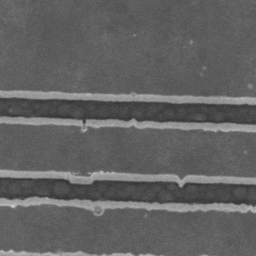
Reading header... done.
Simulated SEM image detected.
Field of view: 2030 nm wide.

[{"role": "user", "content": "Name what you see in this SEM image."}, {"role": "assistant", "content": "one or a few lines or trenches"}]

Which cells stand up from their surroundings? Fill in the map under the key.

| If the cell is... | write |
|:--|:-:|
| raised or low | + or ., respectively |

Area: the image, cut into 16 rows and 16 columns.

++++++++++++++++
++++++++++++++++
++++++++++++++++
++++++++++++++++
++++++++++++++++
++++++++++++++++
................
................
++++++++++++++++
++++++++++++++++
++++++++++++++++
................
................
++++++++++++++++
++++++++++++++++
++++++++++++++++